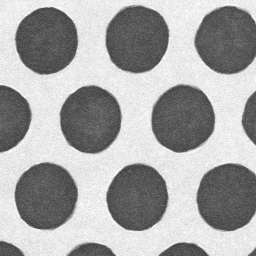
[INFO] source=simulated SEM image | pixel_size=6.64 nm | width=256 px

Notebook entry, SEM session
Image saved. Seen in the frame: holes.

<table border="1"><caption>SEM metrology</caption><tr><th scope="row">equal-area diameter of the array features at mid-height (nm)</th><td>431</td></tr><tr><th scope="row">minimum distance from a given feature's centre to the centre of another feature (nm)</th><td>599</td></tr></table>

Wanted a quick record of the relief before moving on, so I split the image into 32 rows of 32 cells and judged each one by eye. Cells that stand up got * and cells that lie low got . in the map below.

********************************
****....*******.....******.....*
***......*****.......****.......
**.......****........****.......
**........***........***........
**........***........***........
**.......****........****.......
***......*****......*****.......
****....*******....*******.....*
********************************
********************************
..*******.....*******....*******
...*****.......*****......*****.
....****.......****........****.
....***........****........***..
....****.......****........***..
...*****.......****........****.
...*****......******......*****.
..*******....********...********
********************************
*****..*********************..**
***.....*******.....******......
**.......*****.......****.......
**........****.......****.......
**........***........****.......
**........***........****.......
**.......*****.......****.......
***.....******......******.....*
****...********....********...**
********************************
.**********.**********..********
...******.....******......*****.